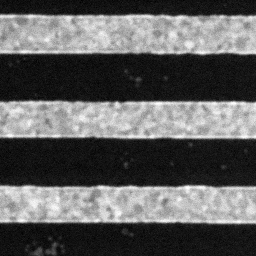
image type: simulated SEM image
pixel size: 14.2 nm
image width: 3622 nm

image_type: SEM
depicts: lines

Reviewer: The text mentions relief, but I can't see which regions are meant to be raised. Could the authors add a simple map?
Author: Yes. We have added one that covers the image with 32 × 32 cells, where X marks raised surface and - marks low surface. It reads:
--------------------------------
--------------------------------
XXXXXXXXXXXXXXXXXXXXXXXXXXXXXXXX
XXXXXXXXXXXXXXXXXXXXXXXXXXXXXXXX
XXXXXXXXXXXXXXXXXXXXXXXXXXXXXXXX
XXXXXXXXXXXXXXXXXXXXXXXXXXXXXXXX
-------------------XX-X-XX---XXX
--------------------------------
--------------------------------
--------------------------------
--------------------------------
--------------------------------
--------------------------------
XXXXXXXXXXXXXXXXXXXXXXXXXXXXXXXX
XXXXXXXXXXXXXXXXXXXXXXXXXXXXXXXX
XXXXXXXXXXXXXXXXXXXXXXXXXXXXXXXX
XXXXXXXXXXXXXXXXXXXXXXXXXXXXXXXX
--------------------------------
--------------------------------
--------------------------------
--------------------------------
--------------------------------
--------------------------------
XXXXX------XXX-XX-----XXXXX-----
XXXXXXXXXXXXXXXXXXXXXXXXXXXXXXXX
XXXXXXXXXXXXXXXXXXXXXXXXXXXXXXXX
XXXXXXXXXXXXXXXXXXXXXXXXXXXXXXXX
XXXXXXXXXXXXXXXXXXXXXXXXXXXXXXXX
--------------------------------
--------------------------------
--------------------------------
--------------------------------